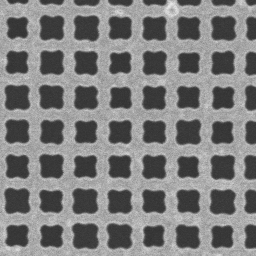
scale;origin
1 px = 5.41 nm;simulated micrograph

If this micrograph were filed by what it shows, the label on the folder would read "a regular array of holes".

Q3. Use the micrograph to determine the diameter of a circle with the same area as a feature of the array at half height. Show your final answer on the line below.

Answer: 25.3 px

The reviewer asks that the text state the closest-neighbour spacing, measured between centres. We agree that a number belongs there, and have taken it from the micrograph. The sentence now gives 0.184 micrometres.